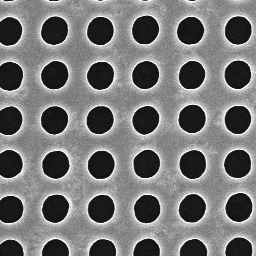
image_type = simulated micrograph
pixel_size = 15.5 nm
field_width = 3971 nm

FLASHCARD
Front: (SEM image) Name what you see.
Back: a regular array of holes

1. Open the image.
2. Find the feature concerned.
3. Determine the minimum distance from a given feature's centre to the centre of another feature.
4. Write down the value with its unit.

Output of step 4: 44.2 px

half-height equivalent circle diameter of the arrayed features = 430 nm